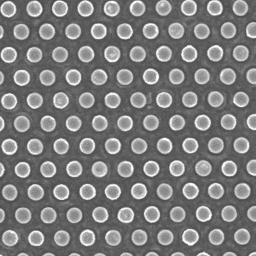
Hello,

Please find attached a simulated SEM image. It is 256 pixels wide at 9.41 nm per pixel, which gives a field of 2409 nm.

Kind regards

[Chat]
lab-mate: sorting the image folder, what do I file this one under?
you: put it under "a regular array of raised bodies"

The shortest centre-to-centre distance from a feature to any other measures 240 nm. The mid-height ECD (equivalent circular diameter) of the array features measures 0.146 micrometres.